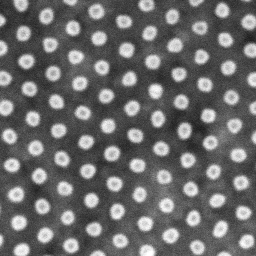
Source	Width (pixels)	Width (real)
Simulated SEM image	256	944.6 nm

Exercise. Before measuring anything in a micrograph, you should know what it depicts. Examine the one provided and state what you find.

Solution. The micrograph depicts a regular array of raised bodies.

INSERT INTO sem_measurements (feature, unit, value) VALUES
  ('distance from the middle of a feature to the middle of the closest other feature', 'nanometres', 103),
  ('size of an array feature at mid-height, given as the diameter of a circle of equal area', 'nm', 46.8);